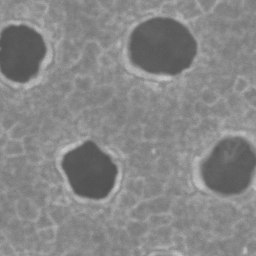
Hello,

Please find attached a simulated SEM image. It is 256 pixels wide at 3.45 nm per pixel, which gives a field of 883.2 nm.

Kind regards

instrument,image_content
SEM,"holes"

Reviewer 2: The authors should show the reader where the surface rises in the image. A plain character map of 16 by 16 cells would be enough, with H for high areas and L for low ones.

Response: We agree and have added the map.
HHHHHHHHHHHHHHHH
HHHHHHHHHLLHHHHH
LLLHHHHHLLLLHHHH
LLLHHHHHLLLLHHHH
LLHHHHHHHLLHHHHH
HHHHHHHHHHHHHHHH
HHHHHHHHHHHHHHHH
HHHHHHHHHHHHHHHH
HHHHHHHHHHHHHHHH
HHHHLLHHHHHHHLLL
HHHHLLLHHHHHHLLL
HHHHLLLHHHHHHLLL
HHHHHHHHHHHHHHHH
HHHHHHHHHHHHHHHH
HHHHHHHHHHHHHHHH
HHHHHHHHHHHHHHHH